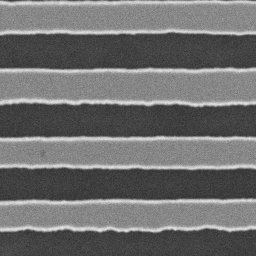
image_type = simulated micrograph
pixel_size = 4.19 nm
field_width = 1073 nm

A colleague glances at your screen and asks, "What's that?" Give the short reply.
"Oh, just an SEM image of lines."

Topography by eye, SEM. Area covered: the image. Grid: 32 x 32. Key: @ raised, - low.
@@@@@@@@@@@@@@@@@@@@@@@@@@@@@@@@
@@@@@@@@@@@@@@@@@@@@@@@@@@@@@@@@
@@@@@@@@@@@@@@@@@@@@@@@@@@@@@@@@
@@@@@@@@@@@@@@@@@@@@@@@@@@@@@@@@
--------------------------------
--------------------------------
--------------------------------
--------------------------------
--------------------------------
@@@@@@@@@@@@@@@@@@@@@@@@@@@@@@@@
@@@@@@@@@@@@@@@@@@@@@@@@@@@@@@@@
@@@@@@@@@@@@@@@@@@@@@@@@@@@@@@@@
@@@@@@@@@@@@@@@@@@@@@@@@@@@@@@@@
--------------------------------
--------------------------------
--------------------------------
--------------------------------
@@@@@@@@@@@@@@@@@@@@@@@@@@@@@@@@
@@@@@@@@@@@@@@@@@@@@@@@@@@@@@@@@
@@@@@@@@@@@@@@@@@@@@@@@@@@@@@@@@
@@@@@@@@@@@@@@@@@@@@@@@@@@@@@@@@
--------------------------------
--------------------------------
--------------------------------
--------------------------------
@@@@@@@@@@@@@@@@@@@@@@@@@@@@@@@@
@@@@@@@@@@@@@@@@@@@@@@@@@@@@@@@@
@@@@@@@@@@@@@@@@@@@@@@@@@@@@@@@@
@@@@@@@@@@@@@@@@@@@@@@@@@@@@@@@@
--------------------------------
--------------------------------
--------------------------------